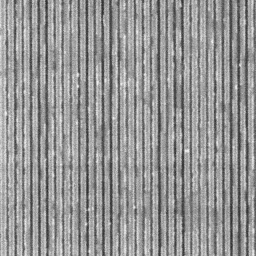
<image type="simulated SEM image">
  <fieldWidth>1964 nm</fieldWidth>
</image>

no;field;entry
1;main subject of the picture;parallel lines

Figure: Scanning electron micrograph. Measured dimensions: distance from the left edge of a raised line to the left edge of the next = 61.2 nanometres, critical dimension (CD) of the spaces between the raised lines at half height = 23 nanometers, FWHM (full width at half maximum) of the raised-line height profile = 37.4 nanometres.